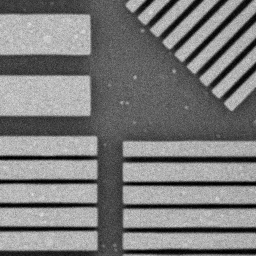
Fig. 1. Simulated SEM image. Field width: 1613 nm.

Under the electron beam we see groups of lines, slits or small figures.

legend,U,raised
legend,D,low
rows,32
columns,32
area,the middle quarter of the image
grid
DDDDDDDDDDDDDDDDDDDDDDDDDDDDDDDU
DDDDDDDDDDDDDDDDDDDDDDDDDDDDDDDD
DDDDDDDDDDDDDDDDDDDDDDDDDDDDDDDD
UUUUUUDDDDDDDDDDDDDDDDDDDDDDDDDD
UUUUUUDDDDDDDDDDDDDDDDDDDDDDDDDD
UUUUUUDDDDDDDDDDDDDDDDDDDDDDDDDD
UUUUUUDDDDDDDDDDDDDDDDDDDDDDDDDD
UUUUUUDDDDDDDDDDDDDDDDDDDDDDDDDD
UUUUUUDDDDDDDDDDDDDDDDDDDDDDDDDD
UUUUUUDDDDDDDDDDDDDDDDDDDDDDDDDD
UUUUUUDDDDDDDDDDDDDDDDDDDDDDDDDD
UUUUUUDDDDDDDDDDDDDDDDDDDDDDDDDD
UUUUUUDDDDDDDDDDDDDDDDDDDDDDDDDD
DDDDDDDDDDDDDDDDDDDDDDDDDDDDDDDD
DDDDDDDDDDDDDDDDDDDDDDDDDDDDDDDD
DDDDDDDDDDDDDDDDDDDDDDDDDDDDDDDD
DDDDDDDDDDDDDDDDDDDDDDDDDDDDDDDD
DDDDDDDDDDDDDDDDDDDDDDDDDDDDDDDD
UUUUUUUUDDDDDDDDDDDDDDDDDDDDDDDD
UUUUUUUUDDDDDDDDDDDDDDDDDDDDDDDU
UUUUUUUUDDDDDDDUUUUUUUUUUUUUUUUU
UUUUUUUUDDDDDDDUUUUUUUUUUUUUUUUU
UUUUUUUUDDDDDDDUUUUUUUUUUUUUUUUU
DDDDDDDDDDDDDDDDDDDDDDDDDDDDDDDD
UUUUUUUUDDDDDDDDDDDDDDDDDDDDDDDD
UUUUUUUUDDDDDDDUUUUUUUUUUUUUUUUU
UUUUUUUUDDDDDDDUUUUUUUUUUUUUUUUU
UUUUUUUUDDDDDDDUUUUUUUUUUUUUUUUU
UUUUUUUUDDDDDDDUUUUUUUUUUUUUUUUU
DDDDDDDDDDDDDDDDDDDDDDDDDDDDDDDD
UUUUUUUUDDDDDDDDDDDDDDDDDDDDDDDD
UUUUUUUUDDDDDDDUUUUUUUUUUUUUUUUU